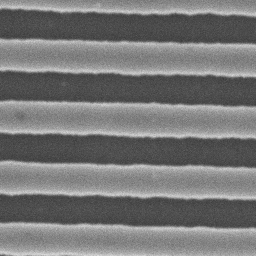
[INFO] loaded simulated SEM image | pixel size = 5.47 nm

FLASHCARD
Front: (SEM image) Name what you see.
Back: lines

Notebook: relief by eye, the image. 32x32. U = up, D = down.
UUUUUUUUUUUUUUUUUUUUUUUUUUUUUUUU
DDDDDDDDDDUDUUUUUUUUUUUUUUUUUUUU
DDDDDDDDDDDDDDDDDDDDDDDDDDDDDDDD
DDDDDDDDDDDDDDDDDDDDDDDDDDDDDDDD
DDDDDDDDDDDDDDDDDDDDDDDDDDDDDDDD
UUUUUUUUUUUUUUUUUUUUUUUUUUDUDDDD
UUUUUUUUUUUUUUUUUUUUUUUUUUUUUUUU
UUUUUUUUUUUUUUUUUUUUUUUUUUUUUUUU
UUUUUUUUUUUUUUUUUUUUUUUUUUUUUUUU
DDDDDDDDDDDDDDDDDDDDDDDDDDDDUUUU
DDDDDDDDDDDDDDDDDDDDDDDDDDDDDDDD
DDDDDDDDDDDDDDDDDDDDDDDDDDDDDDDD
DDDDDDDDDDDDDDDDDDDDDDDDDDDDDDDD
UUUUUUUUUUUUUUUUUUUUUUUUUUUUUUUU
UUUUUUUUUUUUUUUUUUUUUUUUUUUUUUUU
UUUUUUUUUUUUUUUUUUUUUUUUUUUUUUUU
UUUUUUUUUUUUUUUUUUUUUUUUUUUUUUUU
DDDDDDDDDDDDDDDDDDDDDDDDDDDDDDDD
DDDDDDDDDDDDDDDDDDDDDDDDDDDDDDDD
DDDDDDDDDDDDDDDDDDDDDDDDDDDDDDDD
UUUUUDDDDDDDDDDDDDDDDDDDDDDDDDDD
UUUUUUUUUUUUUUUUUUUUUUUUUUUUUUUU
UUUUUUUUUUUUUUUUUUUUUUUUUUUUUUUU
UUUUUUUUUUUUUUUUUUUUUUUUUUUUUUUU
DDDDDDDDDDDDDUUDUUUUUUUUUUUUUUUU
DDDDDDDDDDDDDDDDDDDDDDDDDDDDDDDD
DDDDDDDDDDDDDDDDDDDDDDDDDDDDDDDD
DDDDDDDDDDDDDDDDDDDDDDDDDDDDDDDD
UUUUUUUUUUUUUUUUUUUUUUUDUUDDDDDD
UUUUUUUUUUUUUUUUUUUUUUUUUUUUUUUU
UUUUUUUUUUUUUUUUUUUUUUUUUUUUUUUU
UUUUUUUUUUUUUUUUUUUUUUUUUUUUUUUU